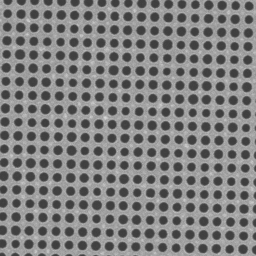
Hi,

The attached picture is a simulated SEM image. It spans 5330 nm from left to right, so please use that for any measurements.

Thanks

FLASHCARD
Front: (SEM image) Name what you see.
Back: a regular array of holes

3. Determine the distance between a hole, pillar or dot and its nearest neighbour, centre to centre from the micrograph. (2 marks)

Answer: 13.3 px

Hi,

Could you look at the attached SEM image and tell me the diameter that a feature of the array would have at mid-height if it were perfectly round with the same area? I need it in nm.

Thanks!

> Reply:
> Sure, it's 205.